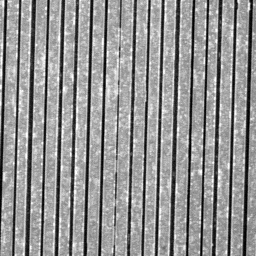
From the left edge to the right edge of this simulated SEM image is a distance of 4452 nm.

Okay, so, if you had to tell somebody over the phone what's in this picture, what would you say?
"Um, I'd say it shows parallel lines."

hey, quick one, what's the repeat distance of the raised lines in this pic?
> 250 nanometers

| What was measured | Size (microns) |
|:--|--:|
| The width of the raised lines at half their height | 0.182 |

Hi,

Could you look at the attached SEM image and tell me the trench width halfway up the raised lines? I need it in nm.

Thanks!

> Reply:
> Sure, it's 76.